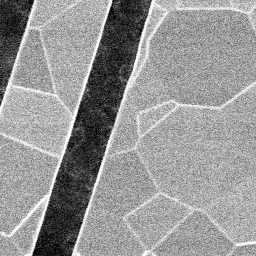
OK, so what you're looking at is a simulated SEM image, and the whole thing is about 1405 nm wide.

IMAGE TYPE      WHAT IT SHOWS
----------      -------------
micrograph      one or a few lines or trenches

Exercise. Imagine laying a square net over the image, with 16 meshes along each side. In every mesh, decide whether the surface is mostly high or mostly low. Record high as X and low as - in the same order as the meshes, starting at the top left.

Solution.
--XXXXX--XXXXXXX
--XXXXX--XXXXXXX
-XXXXX---XXXXXXX
-XXXXX---XXXXXXX
-XXXXX--XXXXXXXX
XXXXX---XXXXXXXX
XXXXX---XXXXXXXX
XXXXX--XXXXXXXXX
XXXX---XXXXXXXXX
XXXX---XXXXXXXXX
XXXX--XXXXXXXXXX
XXX---XXXXXXXXXX
XXX---XXXXXXXXXX
XXX--XXXXXXXXXXX
XX---XXXXXXXXXXX
XX---XXXXXXXXXXX